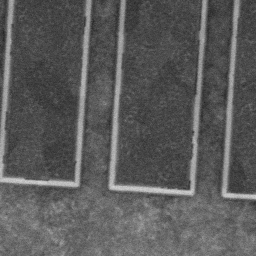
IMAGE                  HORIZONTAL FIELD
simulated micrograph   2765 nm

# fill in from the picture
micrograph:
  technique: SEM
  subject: one or a few lines or trenches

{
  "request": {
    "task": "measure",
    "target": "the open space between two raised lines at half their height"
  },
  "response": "34.3 px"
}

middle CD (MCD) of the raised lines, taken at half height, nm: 831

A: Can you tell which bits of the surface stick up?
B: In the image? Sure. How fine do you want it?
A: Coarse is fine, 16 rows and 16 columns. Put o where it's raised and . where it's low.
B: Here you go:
.ooooo..ooooo..o
.oooo...ooooo..o
.oooo...ooooo..o
.oooo...ooooo..o
ooooo..ooooo...o
ooooo..ooooo..oo
ooooo..ooooo..oo
ooooo..ooooo..oo
ooooo..ooooo..oo
ooooo..ooooo..oo
ooooo..ooooo..oo
.......ooooo..oo
................
................
................
................